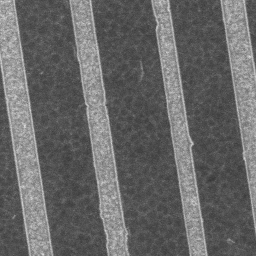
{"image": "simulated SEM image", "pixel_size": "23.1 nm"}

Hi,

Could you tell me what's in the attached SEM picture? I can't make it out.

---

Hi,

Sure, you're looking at one or a few lines or trenches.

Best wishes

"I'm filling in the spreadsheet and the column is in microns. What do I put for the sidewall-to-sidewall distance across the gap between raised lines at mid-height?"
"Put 1.29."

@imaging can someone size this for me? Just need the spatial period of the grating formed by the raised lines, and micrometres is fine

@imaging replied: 1.78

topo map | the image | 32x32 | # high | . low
##.......##........##.......###.
##.......##........##.......###.
##.......###........#.......###.
##.......###........##......###.
##.......###........##......###.
###......###........##......###.
###......###........##.......##.
###.......##........##.......###
###.......###.......##.......###
###.......###.......##.......###
###.......###........##......###
.##........##........##......###
.###.......##........##......###
.###.......##........##.......##
.###.......##........##.......##
.###.......###.......##.......##
.###.......###.......###......##
..##.......###........##......##
..###.......##........##......##
..###.......##........##.......#
..###.......##........##.......#
..###.......###.......##.......#
..###.......###.......##.......#
...##.......###........##......#
...##.......###........##......#
...###.......##........##......#
...###.......##........##.......
...###.......##........##.......
...###.......###.......##.......
...###.......###.......###......
....##.......###........##......
....##.......###........##......